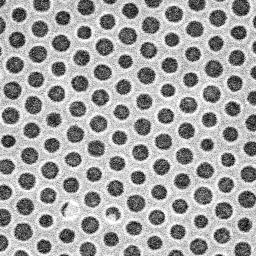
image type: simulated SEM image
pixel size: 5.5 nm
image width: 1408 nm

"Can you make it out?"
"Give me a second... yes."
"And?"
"a regular array of holes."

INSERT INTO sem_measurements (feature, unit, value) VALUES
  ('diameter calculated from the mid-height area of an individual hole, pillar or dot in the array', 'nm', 99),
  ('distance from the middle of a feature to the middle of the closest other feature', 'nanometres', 138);